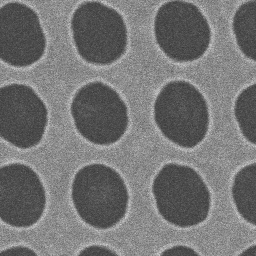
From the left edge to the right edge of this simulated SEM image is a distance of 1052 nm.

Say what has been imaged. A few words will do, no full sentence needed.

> holes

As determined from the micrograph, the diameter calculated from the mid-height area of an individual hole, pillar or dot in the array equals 0.247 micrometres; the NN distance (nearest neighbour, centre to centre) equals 0.336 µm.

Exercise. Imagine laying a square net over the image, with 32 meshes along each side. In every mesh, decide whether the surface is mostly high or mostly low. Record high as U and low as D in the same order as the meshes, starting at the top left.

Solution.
UDDUUUUUUUDDDUUUUUUUUDDDUUUUUUDD
DDDDUUUUUDDDDDDUUUUUDDDDDUUUUDDD
DDDDDUUUUDDDDDDUUUUDDDDDDDUUUDDD
DDDDDUUUUDDDDDDDUUUDDDDDDDUUUDDD
DDDDDDUUUDDDDDDDUUUDDDDDDDUUUDDD
DDDDDDUUUDDDDDDDUUUUDDDDDDUUUUDD
DDDDDDUUUUDDDDDUUUUUUDDDDDUUUUDD
DDDDDUUUUUUDDDDUUUUUUUDDUUUUUUUU
UUUUUUUUUUUUUUUUUUUUUUUUUUUUUUUU
UUUUUUUUUUUUUUUUUUUUUUUUUUUUUUUU
UDDUUUUUUUUDDUUUUUUUUDDDUUUUUUUU
DDDDUUUUUUDDDDUUUUUUDDDDDUUUUUDD
DDDDDUUUUDDDDDDUUUUDDDDDDDUUUUDD
DDDDDDUUUDDDDDDDUUUDDDDDDDUUUDDD
DDDDDDUUUDDDDDDDUUUDDDDDDDUUUDDD
DDDDDDUUUDDDDDDDUUUUDDDDDDUUUUDD
DDDDDDUUUUDDDDDDUUUUDDDDDDUUUUDD
UDDDDUUUUUUDDDDUUUUUUDDDDUUUUUUD
UUUDUUUUUUUUUUUUUUUUUUUDUUUUUUUU
UUUUUUUUUUUUUUUUUUUUUUUUUUUUUUUU
UDDUUUUUUUUUDUUUUUUUUDUUUUUUUUUD
DDDDUUUUUUDDDDDUUUUUDDDDDUUUUUDD
DDDDDUUUUDDDDDDUUUUDDDDDDUUUUDDD
DDDDDUUUUDDDDDDDUUUDDDDDDDUUUDDD
DDDDDDUUUDDDDDDDUUUDDDDDDDUUUDDD
DDDDDDUUUDDDDDDDUUUDDDDDDDUUUDDD
DDDDDUUUUUDDDDDDUUUUDDDDDDUUUUDD
DDDDDUUUUUDDDDDUUUUUUDDDDDUUUUUD
UUUUUUUUUUUUDDUUUUUUUUUUUUUUUUUU
UUUUUUUUUUUUUUUUUUUUUUUUUUUUUUUU
UUUUUUUUUUUUUUUUUUUUUUUUUUUUUUUU
DDDDUUUUUUDDDDUUUUUUDDDDDUUUUUDD